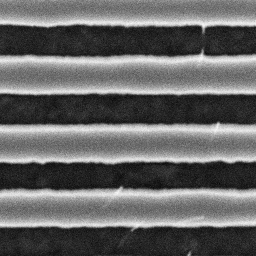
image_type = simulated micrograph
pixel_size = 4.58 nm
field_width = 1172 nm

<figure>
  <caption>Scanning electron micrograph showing lines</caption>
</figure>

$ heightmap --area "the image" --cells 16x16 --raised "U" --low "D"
UUUUUUUUUUUUUUUU
UUUUUUUUUUUUUUUU
DDDDDDDDDDDDDDDD
DDDDDDDDDDDDUDDD
UUUUUUUUUUUUUUUU
UUUUUUUUUUUUUUUU
DDDDDDDDDDDDDDDD
DDDDDDDDDDDDDDDD
UUUUUUUUUUUUUUUU
UUUUUUUUUUUUUUUU
DDDDDDDDDDDDDDDD
DDDDDDDDDDDDDDDD
UUUUUUUUUUUUUUUU
UUUUUUUUUUUUUUUU
DDDDDDDDDDDDDDDD
DDDDDDDDDDDDDDDD